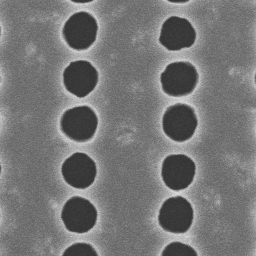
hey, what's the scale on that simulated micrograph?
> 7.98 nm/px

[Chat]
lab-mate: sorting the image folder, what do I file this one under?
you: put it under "a regular array of holes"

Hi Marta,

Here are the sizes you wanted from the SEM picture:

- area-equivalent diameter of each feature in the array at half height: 284 nm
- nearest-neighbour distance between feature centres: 0.353 um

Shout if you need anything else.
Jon